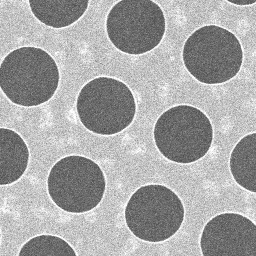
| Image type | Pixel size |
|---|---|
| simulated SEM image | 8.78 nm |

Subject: holes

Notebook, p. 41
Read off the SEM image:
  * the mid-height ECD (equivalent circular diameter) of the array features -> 0.513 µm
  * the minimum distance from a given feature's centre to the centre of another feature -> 730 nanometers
